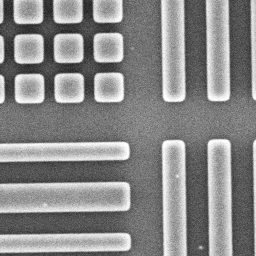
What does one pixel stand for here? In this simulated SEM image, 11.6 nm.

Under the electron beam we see groups of lines, slits or small figures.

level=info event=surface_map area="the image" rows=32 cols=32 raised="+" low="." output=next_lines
..+++..+++..+++.....+++...++...+
..+++..+++..+++.....+++...++...+
..+++..+++..+++.....+++...++...+
....................+++...+++..+
..+++..+++..+++.....+++...+++..+
..+++..+++..+++.....+++...+++..+
..+++..+++..+++.....+++...+++..+
..+++..+++..+++.....+++...+++...
....................+++...+++...
..+++..+++..+++.....+++...+++...
..+++..+++..+++.....+++...+++...
..+++..+++..+++.....+++...+++...
..+++..+++..+++......++....+....
................................
................................
................................
................................
................................
++++++++++++++++....+++...+++...
++++++++++++++++....+++...+++...
....................+++...+++...
....................+++...+++...
....................+++...+++...
++++++++++++++++....+++...+++...
++++++++++++++++....+++...+++...
++++++++++++++++....+++...+++...
....................+++...+++...
....................+++...+++...
.....................++...+++...
++++++++++++++++.....++...+++...
++++++++++++++++.....++...+++...
++++.................++...+++...